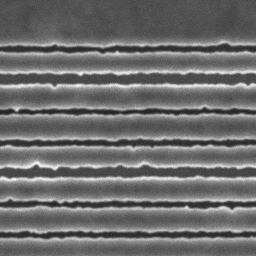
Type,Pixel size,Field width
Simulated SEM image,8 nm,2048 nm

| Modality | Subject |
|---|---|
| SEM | parallel lines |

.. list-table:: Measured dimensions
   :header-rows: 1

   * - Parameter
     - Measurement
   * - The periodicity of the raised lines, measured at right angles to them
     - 251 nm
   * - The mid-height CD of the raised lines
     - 185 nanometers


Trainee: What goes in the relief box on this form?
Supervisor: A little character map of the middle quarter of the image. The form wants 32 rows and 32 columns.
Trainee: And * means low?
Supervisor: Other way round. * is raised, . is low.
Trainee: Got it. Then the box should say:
********************************
********************************
...**........**.................
................................
................................
***************.****************
********************************
********************************
********************************
********************************
********************************
................................
................................
********************************
********************************
********************************
********************************
********************************
********************************
................................
..*.............................
********************************
********************************
********************************
********************************
*****..****.*...***...*******...
................................
................................
**.........*.**....*****.**.....
********************************
********************************
********************************